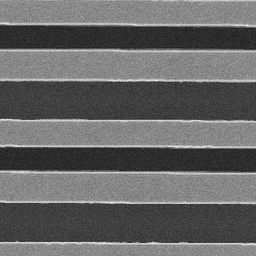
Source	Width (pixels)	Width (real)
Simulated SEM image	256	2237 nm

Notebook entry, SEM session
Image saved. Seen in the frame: lines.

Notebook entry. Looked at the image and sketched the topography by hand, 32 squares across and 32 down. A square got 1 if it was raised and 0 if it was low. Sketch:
11111111111111111111111111111111
11111111111111111111111111111111
11111111111111111111111111111111
00000000000000000000000000000000
00000000000000000000000000000000
00000000000000000000000000000000
11111111111111111111111111111111
11111111111111111111111111111111
11111111111111111111111111111111
11111111111111111111111111111111
00000000000000000000000000000000
00000000000000000000000000000000
00000000000000000000000000000000
00000000000000000000000000000000
00000000000000000000000000000000
11111111111111111111111111111111
11111111111111111111111111111111
11111111111111111111111111111111
00000000000000000000000000000000
00000000000000000000000000000000
00000000000000000000000000000000
11111111000000000000000000000000
11111111111111111111111111111111
11111111111111111111111111111111
11111111111111111111111111111111
00000000000000000000000000000000
00000000000000000000000000000000
00000000000000000000000000000000
00000000000000000000000000000000
00000000000000000000000000000000
11111111111111111111111111111111
11111111111111111111111111111111